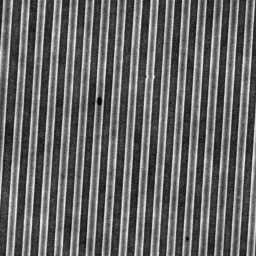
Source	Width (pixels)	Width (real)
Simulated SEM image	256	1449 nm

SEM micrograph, parallel lines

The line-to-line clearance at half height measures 43.1 nm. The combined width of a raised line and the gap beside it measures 16 pixels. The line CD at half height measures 8.36 pixels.